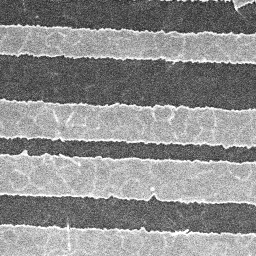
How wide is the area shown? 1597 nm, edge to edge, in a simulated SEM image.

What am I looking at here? one or a few lines or trenches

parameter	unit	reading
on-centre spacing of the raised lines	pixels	67.1